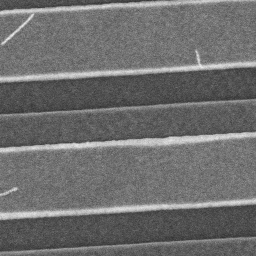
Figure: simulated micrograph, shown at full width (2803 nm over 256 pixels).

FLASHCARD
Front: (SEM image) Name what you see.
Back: lines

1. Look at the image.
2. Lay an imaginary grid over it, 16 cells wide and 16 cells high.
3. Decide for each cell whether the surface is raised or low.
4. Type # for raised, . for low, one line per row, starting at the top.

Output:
...#############
################
################
################
#########.......
................
................
................
.............###
################
################
################
################
##..............
................
................